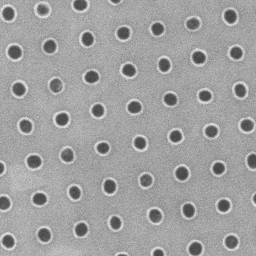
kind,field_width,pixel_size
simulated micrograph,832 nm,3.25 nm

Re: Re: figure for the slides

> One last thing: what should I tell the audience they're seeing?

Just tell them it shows a regular array of raised bodies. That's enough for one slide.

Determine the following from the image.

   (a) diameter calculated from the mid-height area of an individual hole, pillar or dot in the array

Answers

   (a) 52.5 nm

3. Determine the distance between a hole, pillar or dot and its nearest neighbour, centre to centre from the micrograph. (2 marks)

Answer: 116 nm